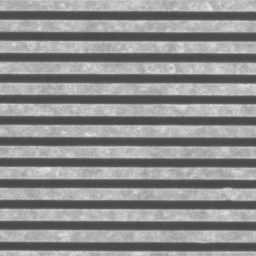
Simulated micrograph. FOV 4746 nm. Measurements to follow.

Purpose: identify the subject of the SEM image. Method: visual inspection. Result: parallel lines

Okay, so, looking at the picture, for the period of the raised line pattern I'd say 0.39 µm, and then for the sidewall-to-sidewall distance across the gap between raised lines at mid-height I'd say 0.151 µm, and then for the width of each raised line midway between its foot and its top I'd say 241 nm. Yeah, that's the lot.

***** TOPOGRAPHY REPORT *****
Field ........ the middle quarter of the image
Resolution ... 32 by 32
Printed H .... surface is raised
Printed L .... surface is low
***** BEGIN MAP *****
HHHHHHHHHHHHHHHHHHHHHHHHHHHHHHHH
HHHHHHHHHHHHHHHHHHHHHHHHHHHHHHHH
LLLLLLLLLLLLLLLLLLLHHHHHHHHHHHHH
LLLLLLLLLLLLLLLLLLLLLLLLLLLLLLLL
LLLLLLLLLLLLLLLLLLLLLLLLLLLLLLLL
HHHHHHHHHHHHHHHHHHHHHHHHHHHHHHHH
HHHHHHHHHHHHHHHHHHHHHHHHHHHHHHHH
HHHHHHHHHHHHHHHHHHHHHHHHHHHHHHHH
LLLLLLLLLLLLLLLLLLLLLLLLLLLLLLLL
LLLLLLLLLLLLLLLLLLLLLLLLLLLLLLLL
HHHHHHHHHHHHHHHHHHHHHHHHHHHHHHHH
HHHHHHHHHHHHHHHHHHHHHHHHHHHHHHHH
HHHHHHHHHHHHHHHHHHHHHHHHHHHHHHHH
LLLLLLLLLLLLLLLLLLLLLLLLLLLLLLLL
LLLLLLLLLLLLLLLLLLLLLLLLLLLLLLLL
HHHHHHHHHHHHHHHHHHHHHHHHHHHHHHHH
HHHHHHHHHHHHHHHHHHHHHHHHHHHHHHHH
HHHHHHHHHHHHHHHHHHHHHHHHHHHHHHHH
LLLLLLLLLLLLLLLLLLLLLLLLLLLLLLLL
LLLLLLLLLLLLLLLLLLLLLLLLLLLLLLLL
LLLLLLLLLLLLLLLLLLLLLLLLLLLLLLLL
HHHHHHHHHHHHHHHHHHHHHHHHHHHHHHHH
HHHHHHHHHHHHHHHHHHHHHHHHHHHHHHHH
LLLLLHHHHHHLLLLLLLLLLLLHHHHHHHHH
LLLLLLLLLLLLLLLLLLLLLLLLLLLLLLLL
LLLLLLLLLLLLLLLLLLLLLLLLLLLLLLLL
HHHHHHHHHHHHHHHHHHHHHHHHHHHHHHHH
HHHHHHHHHHHHHHHHHHHHHHHHHHHHHHHH
HHHHHHHHHHHHHHHHHHHHHHHHHHHHHHHH
LLLLLLLLLLLLLLLLLLLLLLLLLLLLLLLL
LLLLLLLLLLLLLLLLLLLLLLLLLLLLLLLL
HHHHHHHHHHHHHHHHHHHHHHHHHHHHHHHH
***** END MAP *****